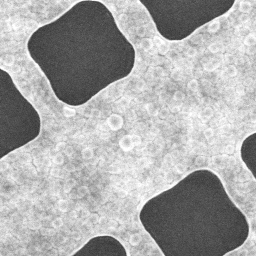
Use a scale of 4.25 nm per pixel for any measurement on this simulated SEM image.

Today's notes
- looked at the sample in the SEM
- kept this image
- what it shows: holes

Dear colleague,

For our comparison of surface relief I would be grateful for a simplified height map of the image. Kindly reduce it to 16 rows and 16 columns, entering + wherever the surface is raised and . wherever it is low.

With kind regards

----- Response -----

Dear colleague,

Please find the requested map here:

++++...++.....++
+++....+++...+++
++......++++++++
++......++++++++
+++.....++++++++
.++....+++++++++
..++.+++++++++++
..++++++++++++++
..++++++++++++++
.++++++++++++++.
+++++++++++++++.
+++++++++++...++
+++++++++.....++
+++++++++......+
+++++++++.......
+++++...++.....+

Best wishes